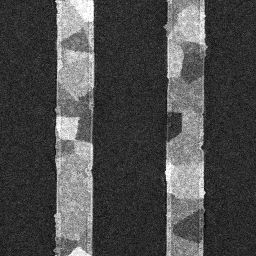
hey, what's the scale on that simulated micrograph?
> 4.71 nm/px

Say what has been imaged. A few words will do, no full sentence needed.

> one or a few lines or trenches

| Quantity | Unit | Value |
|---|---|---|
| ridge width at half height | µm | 0.17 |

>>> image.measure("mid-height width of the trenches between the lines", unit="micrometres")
0.352